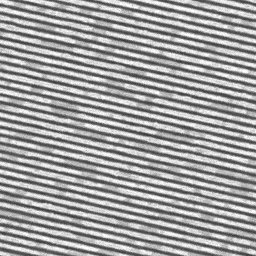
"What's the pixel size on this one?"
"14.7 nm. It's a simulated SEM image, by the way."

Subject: parallel lines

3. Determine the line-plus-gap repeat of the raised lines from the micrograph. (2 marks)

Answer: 117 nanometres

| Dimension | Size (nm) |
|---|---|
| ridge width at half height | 55.6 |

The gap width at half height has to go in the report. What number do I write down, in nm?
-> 55.6